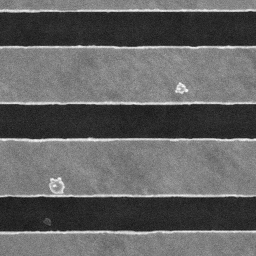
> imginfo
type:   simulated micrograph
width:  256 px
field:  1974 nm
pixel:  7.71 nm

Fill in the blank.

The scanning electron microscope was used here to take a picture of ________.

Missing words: lines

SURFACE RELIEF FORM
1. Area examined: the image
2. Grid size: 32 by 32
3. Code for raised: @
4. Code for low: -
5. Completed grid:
@@@@@@@@@@@@@@@@@@@@@@@@@@@@@@@@
--------------------------------
--------------------------------
--------------------------------
--------------------------------
--------------------------------
@@@@@@@@@@@@@@@@@@@@@@@@@@@@@@@@
@@@@@@@@@@@@@@@@@@@@@@@@@@@@@@@@
@@@@@@@@@@@@@@@@@@@@@@@@@@@@@@@@
@@@@@@@@@@@@@@@@@@@@@@@@@@@@@@@@
@@@@@@@@@@@@@@@@@@@@@@@@@@@@@@@@
@@@@@@@@@@@@@@@@@@@@@@@@@@@@@@@@
@@@@@@@@@@@@@@@@@@@@@@@@@@@@@@@@
--------------------------------
--------------------------------
--------------------------------
--------------------------------
@@@@@@@@@@@@@@@@@@@@@@@@@@@@@@@@
@@@@@@@@@@@@@@@@@@@@@@@@@@@@@@@@
@@@@@@@@@@@@@@@@@@@@@@@@@@@@@@@@
@@@@@@@@@@@@@@@@@@@@@@@@@@@@@@@@
@@@@@@@@@@@@@@@@@@@@@@@@@@@@@@@@
@@@@@@@@@@@@@@@@@@@@@@@@@@@@@@@@
@@@@@@@@@@@@@@@@@@@@@@@@@@@@@@@@
@-@@@@@@@@@@@@@@@@@@@--@@@@---@@
--------------------------------
--------------------------------
--------------------------------
--------------------------------
@@@@@@@@@@@@@@@@@@@@@@@@@@@@@@@@
@@@@@@@@@@@@@@@@@@@@@@@@@@@@@@@@
@@@@@@@@@@@@@@@@@@@@@@@@@@@@@@@@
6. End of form